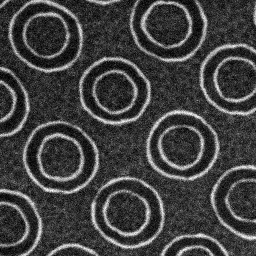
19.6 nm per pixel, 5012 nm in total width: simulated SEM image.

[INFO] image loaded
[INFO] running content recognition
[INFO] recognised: ring-shaped raised bodies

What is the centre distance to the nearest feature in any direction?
1.68 µm